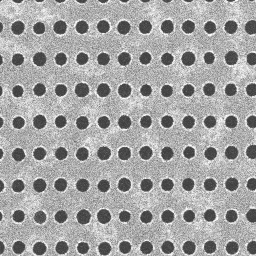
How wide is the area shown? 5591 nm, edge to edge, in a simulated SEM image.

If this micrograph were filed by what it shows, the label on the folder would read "a regular array of holes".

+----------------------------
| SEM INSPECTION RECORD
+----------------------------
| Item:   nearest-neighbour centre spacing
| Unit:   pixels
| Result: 21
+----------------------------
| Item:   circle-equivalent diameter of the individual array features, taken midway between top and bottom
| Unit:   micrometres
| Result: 0.291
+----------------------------